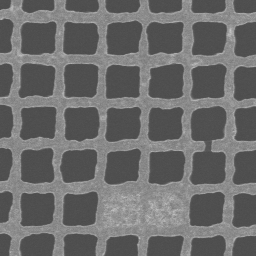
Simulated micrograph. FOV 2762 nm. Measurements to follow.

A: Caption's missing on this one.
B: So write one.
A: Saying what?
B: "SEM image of a regular array of holes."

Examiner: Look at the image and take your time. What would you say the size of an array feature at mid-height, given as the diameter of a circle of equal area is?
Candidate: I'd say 399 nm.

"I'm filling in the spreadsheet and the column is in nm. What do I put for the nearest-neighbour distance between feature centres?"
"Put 452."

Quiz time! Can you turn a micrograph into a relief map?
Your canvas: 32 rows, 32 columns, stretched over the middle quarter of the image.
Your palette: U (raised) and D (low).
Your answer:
DDDDDDDDUUUDDDDDDDUUUUUUDDDDDDUU
DDDDDDDDDUUDDDDDDDDUUUDDDDDDDDUU
DDDDDDDDDUDDDDDDDDDUUUDDDDDDDDUU
DDDDDDDDDUDDDDDDDDDUUUDDDDDDDDUU
DDDDDDDDDUDDDDDDDDDUUDDDDDDDDDUU
DDDDDDDDUUDDDDDDDDDUUDDDDDDDDDUU
DDDDDDDDUUDDDDDDDDDUUDDDDDDDDDUU
DDDDDDDDUUDDDDDDDDDUUDDDDDDDDDUU
UUUDUUDUUUUDDDUUUDUUUUUUDDDDDUUU
UUUUUUUUUUUUUUUUUUUUUUUUUUUUUUUU
UUUUUUUUUUUUUUUUUUUUUUUUUUUUUUUU
DDDDDDDDUUUDDDDDDDDUUDDDDDDDDDUU
DDDDDDDDDUUDDDDDDDDUUDDDDDDDDDUU
DDDDDDDDDUUDDDDDDDDUUDDDDDDDDUUU
DDDDDDDDDUUDDDDDDDDUUDDDDDDDDUUD
DDDDDDDDDUUDDDDDDDDUUDDDDDDDDDUD
DDDDDDDDDUDDDDDDDDDUUDDDDDDDDDUU
DDDDDDDDDUDDDDDDDDDUUDDDDDDDDUUU
DDDDDDDDUUDDDDDDDDUUUDDDDDDDDUUU
UUUUUUUUUUUUUUUUUUUUUUUUUUUUUUUU
UUUUUUUUUUUUUUUUUUUUUUUUUUUUUUUU
UUDDDDDDUUUUUUUUUDDUUUUUUUUUUUUU
DDDDDDDDUUUDDDDDDDDUUDDDDDDDDDUU
DDDDDDDDDUUDDDDDDDDUUDDDDDDDDDUU
DDDDDDDDUUUDDDDDDDDUUDDDDDDDDDDU
DDDDDDDDUUUDDDDDDDDUUDDDDDDDDDUU
DDDDDDDDUUDDDDDDDDDUUDDDDDDDDDUU
DDDDDDDDUUDDDDDDDDDUUDDDDDDDDDUU
DDDDDDDDUUDDDDDDDDDUUDDDDDDDDDUD
DDDUUUUUUUDDDDDUUUUUUDDDDDDDUUUU
UUUUUUUUUUUUUUUUUUUUUUUUUUUUUUUU
UUUUUUUUUUUUUUUUUUUUUUUUUUUUUUUU